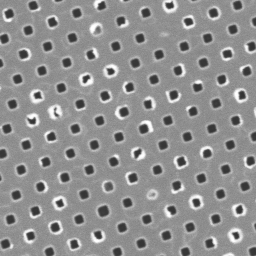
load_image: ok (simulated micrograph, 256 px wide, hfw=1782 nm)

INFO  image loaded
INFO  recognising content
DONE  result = a regular array of holes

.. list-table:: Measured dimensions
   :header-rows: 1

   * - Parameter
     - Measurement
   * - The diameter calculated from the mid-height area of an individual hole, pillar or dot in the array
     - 64.8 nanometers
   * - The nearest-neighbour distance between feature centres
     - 0.172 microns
